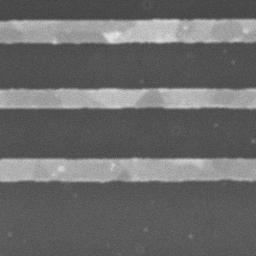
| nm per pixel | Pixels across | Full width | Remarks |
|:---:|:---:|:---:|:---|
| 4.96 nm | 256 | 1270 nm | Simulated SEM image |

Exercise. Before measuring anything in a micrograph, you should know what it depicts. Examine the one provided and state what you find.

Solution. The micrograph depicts lines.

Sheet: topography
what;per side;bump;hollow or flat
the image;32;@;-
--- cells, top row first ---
--------------------------------
--------------------------------
--------------------------------
@@@@@@@@@@@@@@@@@@@@@@@@@@@@@@@@
@@@@@@@@@@@@@@@@@@@@@@@@@@@@@@@@
--------------------------------
--------------------------------
--------------------------------
--------------------------------
--------------------------------
--------------------------------
@@@@@@@@@@@@@@@@@@@@@@@@@@@@@@@@
@@@@@@@@@@@@@@@@@@@@@@@@@@@@@@@@
--------------------------------
--------------------------------
--------------------------------
--------------------------------
--------------------------------
--------------------------------
--------------------------------
@@@@@@@@@@@@@@@@@@@@@@@@@@@@@@@@
@@@@@@@@@@@@@@@@@@@@@@@@@@@@@@@@
@@--@@-@@@@@@@-@@@@-@@@--------@
--------------------------------
--------------------------------
--------------------------------
--------------------------------
--------------------------------
--------------------------------
--------------------------------
--------------------------------
--------------------------------